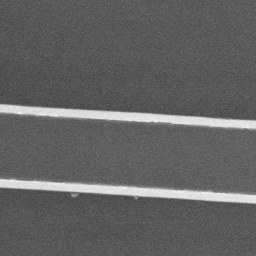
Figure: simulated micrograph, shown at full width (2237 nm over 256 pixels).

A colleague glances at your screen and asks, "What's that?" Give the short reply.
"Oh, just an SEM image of one or a few lines or trenches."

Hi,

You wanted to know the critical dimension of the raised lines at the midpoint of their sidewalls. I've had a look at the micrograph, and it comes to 649 nanometres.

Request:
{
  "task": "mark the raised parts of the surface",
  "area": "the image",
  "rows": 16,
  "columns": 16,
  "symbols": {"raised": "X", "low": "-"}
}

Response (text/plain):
----------------
----------------
----------------
----------------
----------------
----------------
----------------
XXXXXXXXXXX-----
XXXXXXXXXXXXXXXX
XXXXXXXXXXXXXXXX
XXXXXXXXXXXXXXXX
XXXXXXXXXXXXXXXX
----------------
----------------
----------------
----------------